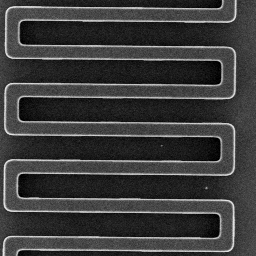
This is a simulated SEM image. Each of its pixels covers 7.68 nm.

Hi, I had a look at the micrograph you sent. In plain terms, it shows groups of lines, slits or small figures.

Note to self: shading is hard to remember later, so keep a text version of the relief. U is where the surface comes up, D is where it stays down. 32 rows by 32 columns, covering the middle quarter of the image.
DDDDDDDDDDDDDDDDDDDDDDDDDDDDDDDD
DDDDDDDDDDDDDDDDDDDDDDDDDDDDDDDD
DDDDDDDDDDDDDDDDDDDDDDDDDDDDDDDD
DDDDDDDDDDDDDDDDDDDDDDDDDDDDDDDD
DDDDDDDDDDDDDDDDDDDDDDDDDDDDDDDD
UUUUUUUUUUUUUUUUUUUUUUUUUUUUUUUU
UUUUUUUUUUUUUUUUUUUUUUUUUUUUUUUU
UUUUUUUUUUUUUUUUUUUUUUUUUUUUUUUU
DDDDDDDDDDDDDDDDDDDDDDDDDDDDDDUU
DDDDDDDDDDDDDDDDDDDDDDDDDDDDDDDD
DDDDDDDDDDDDDDDDDDDDDDDDDDDDDDDD
DDDDDDDDDDDDDDDDDDDDDDDDDDDDDDDD
DDDDDDDDDDDDDDDDDDDDDDDDDDDDDDDD
DDDDDDDDDDDDDDDDDDDDDDDDDDDDDDDD
DDDDDDDDDDDDDDDDDDDDDDDDDDDDDDDD
UUUUUUUUUUUUUUUUUUUUUUUUUUUUUUUU
UUUUUUUUUUUUUUUUUUUUUUUUUUUUUUUU
UUUUUUUUUUUUUUUUUUUUUUUUUUUUUUUU
DDDDDDDDDDDDDDDDDDDDDDDDDDDDDDDD
DDDDDDDDDDDDDDDDDDDDDDDDDDDDDDDD
DDDDDDDDDDDDDDDDDDDDDDDDDDDDDDDD
DDDDDDDDDDDDDDDDDDDDDDDDDDDDDDDD
DDDDDDDDDDDDDDDDDDDDDDDDDDDDDDDD
DDDDDDDDDDDDDDDDDDDDDDDDDDDDDDDD
UUUUUUUUUUUUUUUUUUUUUUUUUUUUUUUU
UUUUUUUUUUUUUUUUUUUUUUUUUUUUUUUU
UUUUUUUUUUUUUUUUUUUUUUUUUUUUUUUU
DDDDDDDDDDUUUUUUUUUUUUUUUUUUUUUU
DDDDDDDDDDDDDDDDDDDDDDDDDDDDDDDD
DDDDDDDDDDDDDDDDDDDDDDDDDDDDDDDD
DDDDDDDDDDDDDDDDDDDDDDDDDDDDDDDD
DDDDDDDDDDDDDDDDDDDDDDDDDDDDDDDD